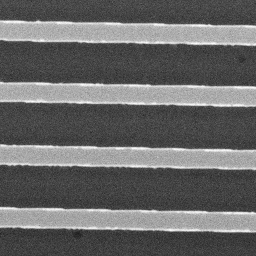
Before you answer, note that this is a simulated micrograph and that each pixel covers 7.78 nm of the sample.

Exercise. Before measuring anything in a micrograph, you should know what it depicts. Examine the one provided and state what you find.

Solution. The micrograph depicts lines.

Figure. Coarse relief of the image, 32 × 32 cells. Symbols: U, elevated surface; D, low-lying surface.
DDDDDDDDDDDDDDDDDDDDDDDDDDDDDDDD
DDDDDDDDDDDDDDDDDDDDDDDDDDDDDDDD
DDDDDDDDDDDDDDDDDDDDDDDDDDDDDDDD
UUUUUUUUUUUUUUUUUUUUUUUUUUUUUUUU
UUUUUUUUUUUUUUUUUUUUUUUUUUUUUUUU
DDDDDDDDDDDDDDDDDDDDDDDDDDDDDDUU
DDDDDDDDDDDDDDDDDDDDDDDDDDDDDDDD
DDDDDDDDDDDDDDDDDDDDDDDDDDDDDDDD
DDDDDDDDDDDDDDDDDDDDDDDDDDDDDDDD
DDDDDDDDDDDDDDDDDDDDDDDDDDDDDDDD
UUUUUUUDDDDDDDDDDDDDDDDDDDDDDDDD
UUUUUUUUUUUUUUUUUUUUUUUUUUUUUUUU
UUUUUUUUUUUUUUUUUUUUUUUUUUUUUUUU
DDDDDDDDDDDDDDDDDDDDDDDDDDDDDDDD
DDDDDDDDDDDDDDDDDDDDDDDDDDDDDDDD
DDDDDDDDDDDDDDDDDDDDDDDDDDDDDDDD
DDDDDDDDDDDDDDDDDDDDDDDDDDDDDDDD
DDDDDDDDDDDDDDDDDDDDDDDDDDDDDDDD
UUUUUUUUUUUUDDDDDDDDDDDDDDDDDDDD
UUUUUUUUUUUUUUUUUUUUUUUUUUUUUUUU
DUUUUUUUUUUUUUUUUUUUUUUUUUUUUUUU
DDDDDDDDDDDDDDDDDDDDDDDDDDDDDDDD
DDDDDDDDDDDDDDDDDDDDDDDDDDDDDDDD
DDDDDDDDDDDDDDDDDDDDDDDDDDDDDDDD
DDDDDDDDDDDDDDDDDDDDDDDDDDDDDDDD
DDDDDDDDDDDDDDDDDDDDDDDDDDDDDDDD
UUUUUUUUUUUUUUUUUUUUUUUUUUDDDDDD
UUUUUUUUUUUUUUUUUUUUUUUUUUUUUUUU
DDDDDDDDDDUUUUUUUUUUUUUUUUUUUUUU
DDDDDDDDDDDDDDDDDDDDDDDDDDDDDDDD
DDDDDDDDDDDDDDDDDDDDDDDDDDDDDDDD
DDDDDDDDDDDDDDDDDDDDDDDDDDDDDDDD